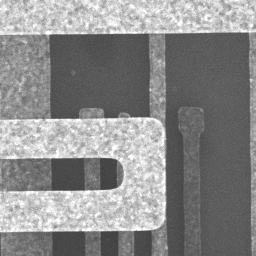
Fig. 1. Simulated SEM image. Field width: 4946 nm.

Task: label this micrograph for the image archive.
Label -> wiring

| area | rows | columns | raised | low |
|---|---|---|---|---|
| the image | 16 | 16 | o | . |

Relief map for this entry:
oooooooooooooooo
oooooooooooooooo
................
................
................
................
................
oooooooooo......
oooooooooo......
oooooooooo......
........oo......
.......ooo......
oooooooooo......
oooooooooo......
................
................